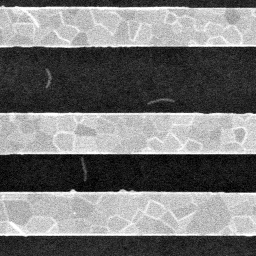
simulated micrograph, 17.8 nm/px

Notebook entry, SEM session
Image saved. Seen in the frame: lines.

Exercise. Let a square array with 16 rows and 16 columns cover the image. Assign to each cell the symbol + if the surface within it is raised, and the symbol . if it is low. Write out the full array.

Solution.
++..............
++++++++++++++++
++++++++++++++++
................
................
................
................
++++++++++++++++
++++++++++++++++
++++++++++++++++
................
................
++++++++++++++++
++++++++++++++++
++++++++++++++++
................